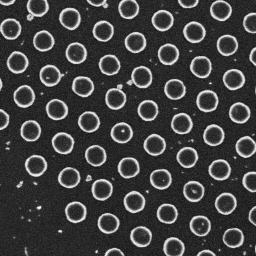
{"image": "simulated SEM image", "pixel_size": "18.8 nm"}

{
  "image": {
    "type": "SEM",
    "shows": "a regular array of raised bodies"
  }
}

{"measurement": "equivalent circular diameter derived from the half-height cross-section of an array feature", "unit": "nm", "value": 374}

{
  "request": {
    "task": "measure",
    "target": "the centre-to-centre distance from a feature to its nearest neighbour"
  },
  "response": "639 nm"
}